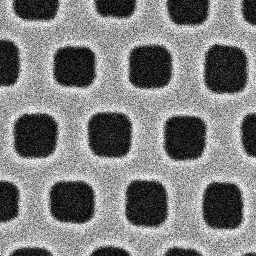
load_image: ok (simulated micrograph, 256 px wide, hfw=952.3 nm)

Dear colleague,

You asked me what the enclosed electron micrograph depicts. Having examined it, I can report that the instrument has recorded a regular array of holes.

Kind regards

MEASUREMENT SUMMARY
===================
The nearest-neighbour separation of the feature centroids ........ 280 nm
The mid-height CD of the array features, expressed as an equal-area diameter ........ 180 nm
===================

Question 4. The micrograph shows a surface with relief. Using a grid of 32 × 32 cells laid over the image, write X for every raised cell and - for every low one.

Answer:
X------XXXXX-----XXXX-----XXXX--
XX-----XXXXX-----XXXX-----XXXX--
XXX---XXXXXXXXXXXXXXX-----XXXXX-
XXXXXXXXXXXXXXXXXXXXXXXXXXXXXXXX
XXXXXXXXXXXXXXXXXXXXXXXXXXXXXXXX
--XXXXXXXXXXXXXXXXX-XXXXXXXXXXXX
--XXXXX-----XXXX-----XXXXX-----X
---XXXX-----XXXX------XXX------X
---XXXX-----XXXX------XXX------X
--XXXXX-----XXXX------XXX------X
--XXXXX-----XXXX-----XXXXX-----X
XXXXXXXXXXXXXXXXXXXXXXXXXX----XX
XXXXXXXXXXXXXXXXXXXXXXXXXXXXXXXX
XXXXXXXXXXXXXXXXXXXXXXXXXXXXXXXX
XX----XXXXX-----XXXXX----XXXXXX-
XX-----XXXX-----XXXXX-----XXXX--
XX-----XXXX------XXX------XXXX--
XX-----XXXX-----XXXX------XXXX--
XX-----XXXX-----XXXX------XXXX--
XX----XXXXXX----XXXXX----XXXXXX-
XXXXXXXXXXXXXXXXXXXXXXXXXXXXXXXX
XXXXXXXXXXXXXXXXXXXXXXXXXXXXXXXX
XXXXXXXXXXXXXXXXX--XXXXXXXXXXXXX
--XXXX------XXXX-----XXXXX----XX
---XXX------XXXX-----XXXX-----XX
---XXX------XXXX-----XXXX------X
--XXXX------XXXX-----XXXX-----XX
--XXXXX----XXXXX-----XXXX-----XX
XXXXXXXXXXXXXXXXXXXXXXXXXX----XX
XXXXXXXXXXXXXXXXXXXXXXXXXXXXXXXX
XXXXXXXXXXXXXXXXXXXXXXXXXXXXXXXX
X-----XXXXX-----XXXXX----XXXXXX-